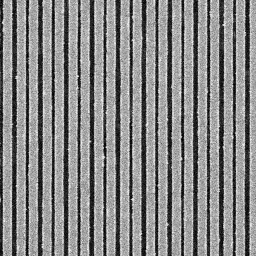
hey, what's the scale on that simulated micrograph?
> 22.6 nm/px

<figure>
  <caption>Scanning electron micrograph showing parallel lines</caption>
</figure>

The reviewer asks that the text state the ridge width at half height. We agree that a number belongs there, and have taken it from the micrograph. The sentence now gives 0.197 micrometres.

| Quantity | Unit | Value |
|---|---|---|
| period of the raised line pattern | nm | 292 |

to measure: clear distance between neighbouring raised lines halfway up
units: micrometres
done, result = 0.102